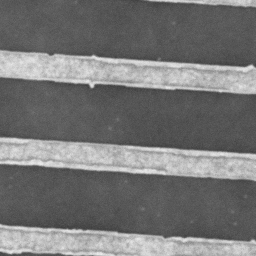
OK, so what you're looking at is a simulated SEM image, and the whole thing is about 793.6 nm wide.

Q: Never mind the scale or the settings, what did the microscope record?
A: one or a few lines or trenches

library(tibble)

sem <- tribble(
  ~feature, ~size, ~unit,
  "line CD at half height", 78.1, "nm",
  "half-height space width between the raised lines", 189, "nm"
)